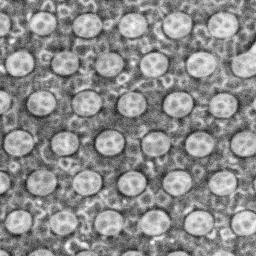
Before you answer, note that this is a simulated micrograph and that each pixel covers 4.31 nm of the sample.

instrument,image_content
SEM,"a regular array of raised bodies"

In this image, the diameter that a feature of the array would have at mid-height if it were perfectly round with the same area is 0.109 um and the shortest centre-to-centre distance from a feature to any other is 193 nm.